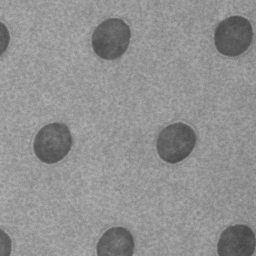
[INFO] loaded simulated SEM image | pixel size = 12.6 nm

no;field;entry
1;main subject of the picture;holes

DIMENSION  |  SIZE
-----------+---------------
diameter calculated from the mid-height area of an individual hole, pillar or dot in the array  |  507 nm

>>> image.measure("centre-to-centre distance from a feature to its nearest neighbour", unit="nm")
1510